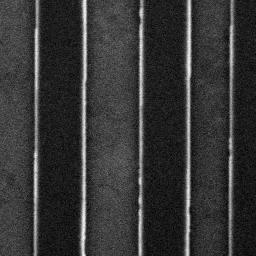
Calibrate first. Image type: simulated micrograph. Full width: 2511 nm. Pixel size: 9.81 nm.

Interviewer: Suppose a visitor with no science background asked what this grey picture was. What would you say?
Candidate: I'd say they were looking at lines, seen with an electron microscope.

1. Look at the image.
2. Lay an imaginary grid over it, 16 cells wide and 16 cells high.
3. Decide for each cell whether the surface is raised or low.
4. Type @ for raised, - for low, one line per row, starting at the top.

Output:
--@@@----@@@--@@
--@@@----@@@--@@
--@@@----@@@--@@
--@@@----@@@--@@
--@@@----@@@--@@
--@@@----@@@--@@
--@@@----@@@--@@
--@@@----@@@--@@
--@@@----@@@--@@
--@@@----@@@--@@
--@@@----@@@--@@
--@@@----@@@--@@
--@@@----@@@--@@
--@@@----@@@--@@
--@@@----@@@--@@
--@@@----@@@--@@